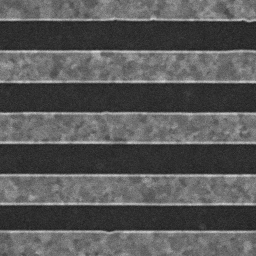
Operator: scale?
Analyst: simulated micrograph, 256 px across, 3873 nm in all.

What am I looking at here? one or a few lines or trenches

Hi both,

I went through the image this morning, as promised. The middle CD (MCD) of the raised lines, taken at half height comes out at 459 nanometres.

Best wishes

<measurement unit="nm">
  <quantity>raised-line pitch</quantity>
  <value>930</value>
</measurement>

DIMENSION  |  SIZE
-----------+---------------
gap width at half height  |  473 nanometres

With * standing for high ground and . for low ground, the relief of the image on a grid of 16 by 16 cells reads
****************
................
................
****************
****************
................
................
****************
****************
................
................
****************
****************
................
................
****************